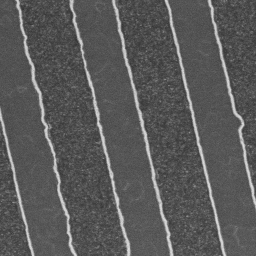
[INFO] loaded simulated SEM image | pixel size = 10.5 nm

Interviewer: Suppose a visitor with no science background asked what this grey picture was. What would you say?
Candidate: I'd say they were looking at one or a few lines or trenches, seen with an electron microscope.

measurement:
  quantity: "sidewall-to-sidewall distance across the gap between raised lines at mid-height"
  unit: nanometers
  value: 436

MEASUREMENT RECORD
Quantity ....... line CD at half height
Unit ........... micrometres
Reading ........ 0.55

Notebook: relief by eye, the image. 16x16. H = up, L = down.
LHHHHLLHHHHLLHHH
LHHHHLLHHHHLLHHH
LLHHHLLLHHHLLLHH
LLHHHLLLHHHLLLHH
LLHHHLLLHHHLLLHH
LLHHHHLLHHHHLLHH
LLLHHHLLLHHHLLLH
LLLHHHLLLHHHLLLH
LLLHHHLLLHHHLLLH
HLLHHHHLLHHHHLLH
HLLHHHHLLLHHHLLH
HLLLHHHLLLHHHLLL
HLLLHHHLLLHHHLLL
HLLLHHHHLLHHHHLL
HHLLHHHHLLHHHHLL
HHLLHHHHLLLHHHLL